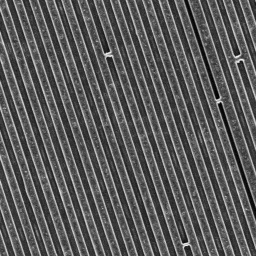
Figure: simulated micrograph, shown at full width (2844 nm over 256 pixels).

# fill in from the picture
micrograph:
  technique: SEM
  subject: parallel lines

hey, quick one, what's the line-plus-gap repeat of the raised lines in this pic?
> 0.17 µm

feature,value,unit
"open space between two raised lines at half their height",76.6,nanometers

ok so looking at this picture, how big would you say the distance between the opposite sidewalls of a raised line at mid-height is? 96.4 nm